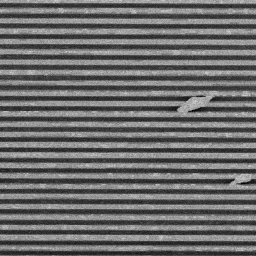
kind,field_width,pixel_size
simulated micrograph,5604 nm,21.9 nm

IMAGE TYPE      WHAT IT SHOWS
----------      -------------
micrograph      parallel lines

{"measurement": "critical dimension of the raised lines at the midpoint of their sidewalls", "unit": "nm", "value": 107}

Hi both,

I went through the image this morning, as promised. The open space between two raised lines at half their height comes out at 4.87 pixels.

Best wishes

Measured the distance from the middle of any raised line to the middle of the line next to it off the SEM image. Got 226 nanometres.